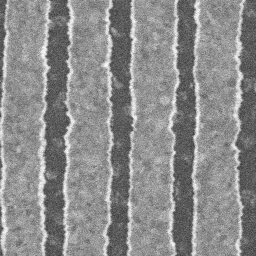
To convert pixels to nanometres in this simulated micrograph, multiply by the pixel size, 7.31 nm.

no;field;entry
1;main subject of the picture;one or a few lines or trenches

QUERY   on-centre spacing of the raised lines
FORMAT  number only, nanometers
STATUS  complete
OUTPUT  471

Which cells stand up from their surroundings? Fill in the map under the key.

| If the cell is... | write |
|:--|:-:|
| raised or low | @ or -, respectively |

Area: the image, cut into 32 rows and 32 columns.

-@@@@@---@@@@@---@@@@@--@@@@@@--
-@@@@@---@@@@@--@@@@@@--@@@@@@--
-@@@@@---@@@@@---@@@@@--@@@@@@--
-@@@@@---@@@@@---@@@@@---@@@@@--
-@@@@@---@@@@@---@@@@@---@@@@@--
-@@@@@---@@@@@---@@@@@--@@@@@@--
-@@@@@---@@@@@--@@@@@@--@@@@@@--
-@@@@@---@@@@@--@@@@@@--@@@@@@--
-@@@@@---@@@@@--@@@@@@--@@@@@@--
@@@@@@---@@@@@---@@@@@--@@@@@@--
@@@@@@---@@@@@--@@@@@@--@@@@@@--
@@@@@@--@@@@@@--@@@@@@---@@@@@--
@@@@@@--@@@@@@--@@@@@@---@@@@@--
@@@@@@---@@@@@---@@@@@---@@@@@--
@@@@@----@@@@@---@@@@----@@@@@--
@@@@@@---@@@@@---@@@@----@@@@@--
@@@@@----@@@@@---@@@@----@@@@@--
@@@@@---@@@@@@--@@@@@@--@@@@@---
@@@@@---@@@@@@---@@@@@---@@@@@--
@@@@@---@@@@@@--@@@@@@--@@@@@@--
@@@@@@--@@@@@@--@@@@@@--@@@@@@--
@@@@@---@@@@@@--@@@@@@--@@@@@@--
@@@@@@--@@@@@@--@@@@@@--@@@@@@--
@@@@@---@@@@@@--@@@@@@--@@@@@@--
@@@@@---@@@@@@--@@@@@---@@@@@@--
@@@@@---@@@@@@--@@@@@@--@@@@@@--
@@@@@---@@@@@@--@@@@@@--@@@@@@--
@@@@@---@@@@@@--@@@@@---@@@@@@--
-@@@@---@@@@@---@@@@@---@@@@@@--
@@@@@@--@@@@@---@@@@@---@@@@@@--
@@@@@---@@@@@---@@@@@@--@@@@@@--
@@@@@---@@@@@---@@@@@@--@@@@@@--